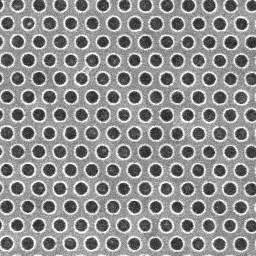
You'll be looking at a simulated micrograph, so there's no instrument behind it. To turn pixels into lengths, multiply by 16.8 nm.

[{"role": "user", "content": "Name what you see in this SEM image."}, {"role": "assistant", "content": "a regular array of holes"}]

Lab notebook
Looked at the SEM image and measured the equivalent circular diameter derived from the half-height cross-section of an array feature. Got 225 nanometres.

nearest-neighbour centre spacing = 350 nanometers